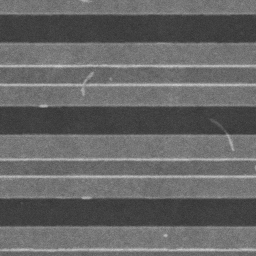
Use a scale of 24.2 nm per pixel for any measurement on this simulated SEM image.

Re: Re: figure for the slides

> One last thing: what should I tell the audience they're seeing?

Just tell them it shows lines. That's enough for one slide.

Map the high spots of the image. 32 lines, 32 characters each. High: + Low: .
++++++++++++++++++++++++++++++++
++++++++++++++++++++++++++++++++
................................
................................
................................
...................++.....+...++
++++++++++++++++++++++++++++++++
++++++++++++++++++++++++++++++++
++++++++++++++++++++++++++++++++
++++++++++++++++++++++++++++++++
++++++++++++++++++++++++++++++++
++++++++++++++++++++++++++++++++
++++++++++++++++++++++++++++++++
................................
................................
................................
................................
++++++++++++++++++++++++++++++++
++++++++++++++++++++++++++++++++
++++++++++++++++++++++++++++++++
++++++++++++++++++++++++++++++++
++++++++++++++++++++++++++++++++
++++++++++++++++++++++++++++++++
++++++++++++++++++++++++++++++++
++++++++++++++++++++++++++++++++
................................
................................
................................
++++++++++++++++++++++++++++++++
++++++++++++++++++++++++++++++++
++++++++++++++++++++++++++++++++
++++++++++++++++++++++++++++++++